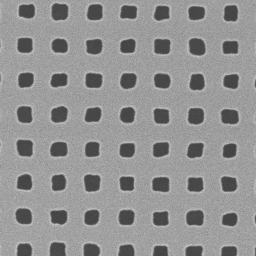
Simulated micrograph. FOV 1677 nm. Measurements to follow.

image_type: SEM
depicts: a regular array of holes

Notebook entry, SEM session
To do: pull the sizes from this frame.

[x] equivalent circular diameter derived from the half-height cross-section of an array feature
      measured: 108 nm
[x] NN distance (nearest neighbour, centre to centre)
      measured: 0.221 microns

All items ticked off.